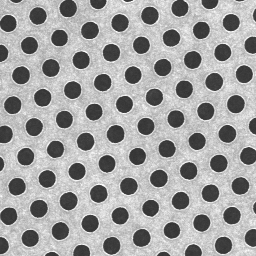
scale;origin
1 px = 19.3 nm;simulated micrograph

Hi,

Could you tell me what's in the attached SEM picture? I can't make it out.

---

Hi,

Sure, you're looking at a regular array of holes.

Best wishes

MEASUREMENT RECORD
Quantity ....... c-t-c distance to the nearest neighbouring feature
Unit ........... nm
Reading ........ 592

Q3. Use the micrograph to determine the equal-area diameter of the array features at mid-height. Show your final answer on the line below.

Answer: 0.341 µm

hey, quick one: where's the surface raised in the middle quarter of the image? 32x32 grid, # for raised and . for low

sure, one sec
###...#################....###..
################...####....#####
#########.#####....####...######
########....###....#############
#..####.....####...##########..#
....####....################....
....#####..##########...####....
....#################....###....
#..###########...###.....####..#
#############....####...########
######...####....#####.#########
#####.....###....###############
..###.....################....##
..####...###########.#####....##
..#################...####....##
..##########..####.....####..###
###########....####...##########
####...####....#####..##########
###....####....################.
###.....####..##########...####.
###....#################....###.
####..###########...####....####
################.....###...#####
#########...####.....###########
#########....####...############
##...####....################...
#....####...###########..####...
#....#################....###...
##...##########..####.....####..
##############....####....######
########..####.....###...#######
#######....###....##############